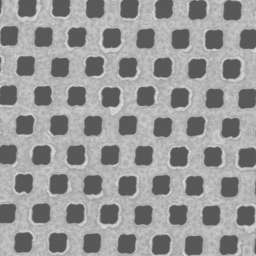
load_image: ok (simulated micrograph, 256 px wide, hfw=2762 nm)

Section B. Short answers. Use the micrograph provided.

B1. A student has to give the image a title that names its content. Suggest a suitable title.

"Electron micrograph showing a regular array of holes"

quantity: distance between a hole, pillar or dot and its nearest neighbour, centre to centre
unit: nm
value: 361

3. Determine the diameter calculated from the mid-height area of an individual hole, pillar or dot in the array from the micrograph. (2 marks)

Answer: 220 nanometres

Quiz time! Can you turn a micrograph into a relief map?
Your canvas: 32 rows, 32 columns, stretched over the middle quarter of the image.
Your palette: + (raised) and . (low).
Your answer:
.++++.....++++....+++++....++++.
.++++.....++++....+++++....++++.
.++++....+++++....+++++....++++.
+++++++++++++++++++++++++.++++++
++++++++++++++++++++++++++++++++
+++++++++++++++++++++.++++++++++
+....+++++....++++.....++++....+
+....++++.....++++.....++++....+
+....+++++....++++.....++++....+
+....++++.....++++.....++++....+
++++++++++...++++++...+++++....+
++++++++++++++++++++++++++++++++
++++++++++++++++++++++++++++++++
.++++....+++++....+++++...+++++.
.++++.....++++....+++++....++++.
.++++....+++++....++++.....++++.
.++++....+++++....++++.....++++.
+++++....+++++...+++++.....++++.
++++++++++++++++++++++++++++++++
++++++++++++++++++++++++++++++++
++...+++++...++++++..+++++++++++
+....++++.....++++....+++++....+
+....++++.....++++....+++++....+
+....++++.....++++....+++++....+
+....++++.....++++....+++++....+
+++++++++++++++++++++++++++...++
++++++++++++++++++++++++++++++++
++++++++++++++++++++++++++++++++
.++++....+++++....++++.....++++.
.++++....+++++....++++....++++..
.++++....+++++....++++....+++++.
.++++....++++.....++++....++++..